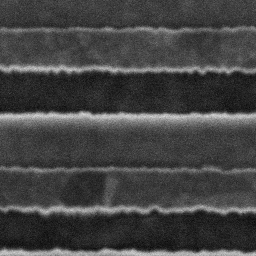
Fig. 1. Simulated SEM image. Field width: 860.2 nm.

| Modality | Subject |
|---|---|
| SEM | lines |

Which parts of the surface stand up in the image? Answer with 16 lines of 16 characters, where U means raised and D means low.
UUUUUUUUUUUUUUUU
UUUUUUUUUUUUUUUU
UUUUUUUUUUUUUUUU
UUUUUUUUUUUUUUUU
DDDDDDDDDDDDDDDD
DDDDDDDDDDDDDDDD
DDDDDDDDDDDDDDDD
UUUUUUUUUUUUUUUU
UUUUUUUUUUUUUUUU
UUUUUUUUUUUUUUUU
UUUUUUUUUUUUUUUU
UUUUUUUUUUUUUUUU
UUUUUUUUUUUUUUUU
DDDDDDDDDDDDDDDD
DDDDDDDDDDDDDDDD
DDDDDDDDDDDDDDDD